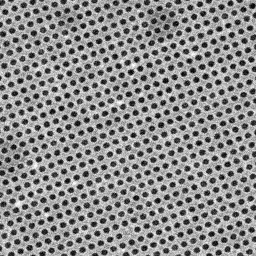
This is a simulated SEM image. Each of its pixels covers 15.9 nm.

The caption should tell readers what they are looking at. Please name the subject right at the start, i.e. a regular array of holes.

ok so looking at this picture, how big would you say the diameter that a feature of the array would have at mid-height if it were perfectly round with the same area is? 110 nm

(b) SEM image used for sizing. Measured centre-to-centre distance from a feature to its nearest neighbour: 153 nm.